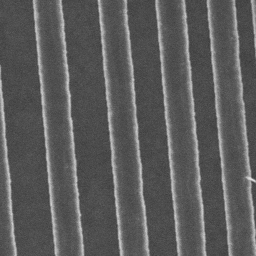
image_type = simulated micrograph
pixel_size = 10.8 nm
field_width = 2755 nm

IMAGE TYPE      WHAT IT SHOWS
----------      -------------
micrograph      lines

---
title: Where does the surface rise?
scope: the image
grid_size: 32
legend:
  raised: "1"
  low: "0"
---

00001111000011110000111000111000
00001111000011110000111000111000
00001111000001110000111000111000
00001111000001110000111000111100
00000111000001110000111000111100
00000111000001110000111000111100
00000111000001110000111000011100
00000111000001110000111100011100
00000111000001111000111100011100
00000111100001111000111100011100
00000111100001111000111100011100
00000111100001111000111100011100
00000111100001111000011100011100
00000111100000111000011100011100
00000111100000111000011100011100
00000111100000111000011100011110
10000011100000111000011100011110
10000011100000111000011110011110
10000011100000111000011110001110
10000011100000111000011110001110
10000011100000111100011110001110
10000011100000111100011110001110
10000011100000111100011110001110
10000011110000111100001110001110
10000011110000111100001110001110
10000011110000111100001110001111
10000011110000011100001110001111
11000001110000011100001110001111
11000001110000011100001110000111
11000001110000011100001110000111
11000001110000011100001111000111
11000001110000011100001111000111